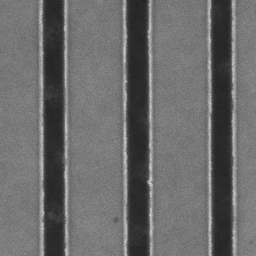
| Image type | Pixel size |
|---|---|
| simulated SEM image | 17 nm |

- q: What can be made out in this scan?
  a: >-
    one or a few lines or trenches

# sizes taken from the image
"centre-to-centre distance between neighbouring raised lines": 1430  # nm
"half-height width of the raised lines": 26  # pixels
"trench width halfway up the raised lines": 984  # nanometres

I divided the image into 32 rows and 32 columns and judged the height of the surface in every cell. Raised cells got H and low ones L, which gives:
LLLLLHHHLLLLLLLLHHHLLLLLLLHHHLLL
LLLLLHHHLLLLLLLLHHHLLLLLLLHHHLLL
LLLLLHHHLLLLLLLLHHHLLLLLLLHHHLLL
LLLLLHHHLLLLLLLLHHHLLLLLLLHHHLLL
LLLLLHHHLLLLLLLLHHHLLLLLLLHHHLLL
LLLLLHHHLLLLLLLLHHHLLLLLLLHHHLLL
LLLLLHHHLLLLLLLLHHHLLLLLLLHHHLLL
LLLLLHHHLLLLLLLLHHHLLLLLLLHHHLLL
LLLLLHHHLLLLLLLLHHHLLLLLLLHHHLLL
LLLLLHHHLLLLLLLLHHHLLLLLLLHHHLLL
LLLLLHHHLLLLLLLLHHHLLLLLLLHHHLLL
LLLLLHHHLLLLLLLLHHHLLLLLLLHHHLLL
LLLLLHHHLLLLLLLLHHHLLLLLLLHHHLLL
LLLLLHHHLLLLLLLLHHHLLLLLLLHHHLLL
LLLLLHHHLLLLLLLLHHHLLLLLLLHHHLLL
LLLLLHHHLLLLLLLLHHHLLLLLLLHHHLLL
LLLLLHHHLLLLLLLLHHHLLLLLLLHHHLLL
LLLLLHHHLLLLLLLLHHHLLLLLLLHHHLLL
LLLLLHHHLLLLLLLLHHHLLLLLLLHHHLLL
LLLLLHHHLLLLLLLLHHHLLLLLLLHHHLLL
LLLLLHHHLLLLLLLLHHHLLLLLLLHHHLLL
LLLLLHHHLLLLLLLLHHHLLLLLLLHHHLLL
LLLLLHHHLLLLLLLLHHHLLLLLLLHHHLLL
LLLLLHHHLLLLLLLLHHHLLLLLLLHHHLLL
LLLLLHHHLLLLLLLLHHHLLLLLLLHHHLLL
LLLLLHHHLLLLLLLLHHHLLLLLLLHHHLLL
LLLLLHHHLLLLLLLLHHHLLLLLLLHHHLLL
LLLLLHHHLLLLLLLLHHHLLLLLLLHHHLLL
LLLLLHHHLLLLLLLLHHHLLLLLLLHHHLLL
LLLLLHHHLLLLLLLLHHHLLLLLLLHHHLLL
LLLLLHHHLLLLLLLLHHHLLLLLLLHHHLLL
LLLLLHHHLLLLLLLLHHHLLLLLLLHHHLLL